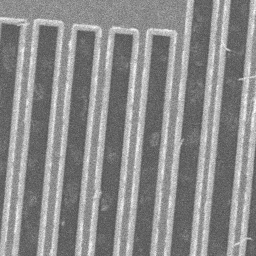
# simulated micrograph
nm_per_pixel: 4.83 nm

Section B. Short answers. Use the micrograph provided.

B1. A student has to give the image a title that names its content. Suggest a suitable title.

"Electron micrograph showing parallel lines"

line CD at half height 0.0746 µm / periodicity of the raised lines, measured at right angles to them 0.182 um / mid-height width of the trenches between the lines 108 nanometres